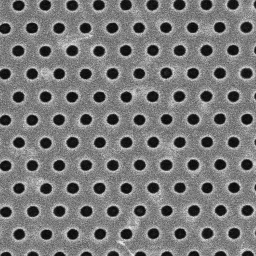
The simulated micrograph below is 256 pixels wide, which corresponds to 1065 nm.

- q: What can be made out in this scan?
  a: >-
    a regular array of holes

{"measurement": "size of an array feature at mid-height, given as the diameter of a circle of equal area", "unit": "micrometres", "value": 0.0475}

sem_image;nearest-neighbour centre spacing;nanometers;109